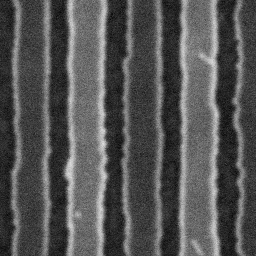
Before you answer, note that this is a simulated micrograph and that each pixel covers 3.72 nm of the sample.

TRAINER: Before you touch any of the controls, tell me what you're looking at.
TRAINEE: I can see lines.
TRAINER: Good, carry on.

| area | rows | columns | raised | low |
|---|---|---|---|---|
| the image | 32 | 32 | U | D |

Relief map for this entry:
DDUUUUDDDUUUUDDDUUUUDDDUUUUDDDUU
DDUUUUDDDUUUUDDDUUUUDDDUUUUDDUUU
DDUUUUDDDUUUUDDDUUUUDDDUUUUDDUUU
DDUUUUDDDUUUUDDDUUUUDDDUUUUDDUUU
DDUUUUDDDUUUUDDDUUUUDDDUUUUDDDUU
DDUUUUDDDUUUUDDDUUUUDDDUUUUDDDUU
DDUUUUDDDUUUUDDDUUUUDDDUUUUDDDUU
DDUUUUDDDUUUUDDDUUUUDDDUUUUDDDUU
DDUUUUDDDUUUUDDDUUUUDDDUUUUDDDUU
DDUUUUDDDUUUUDDDUUUUDDDUUUUDDDUU
DDUUUUDDDUUUUDDDUUUUDDDUUUUDDDUU
DDUUUUDDDUUUUDDDUUUUDDDUUUUDDDUU
DDUUUUDDDUUUUDDUUUUUDDDUUUUDDUUU
DDUUUUDDDUUUUDDDUUUUDDDUUUUDDDUU
DDUUUUDDDUUUUDDDUUUUDDDUUUUDDUUU
DDUUUUDDDUUUUDDDUUUUDDDUUUUDDUUU
DDUUUUDDDUUUUDDDUUUUDDDUUUUDDDUU
DDUUUUDDDUUUUDDDUUUUDDDUUUUDDDUU
DDUUUUDDDUUUUDDDUUUUDDDUUUUDDDUU
DDUUUUDDDUUUUDDDUUUUDDDUUUUDDDUU
DDUUUUDDDUUUUDDUUUUUDDDUUUUDDDUU
DDUUUUDDUUUUUDDDUUUUDDDUUUUDDDUU
DDUUUUDDDUUUUDDDUUUUDDDUUUUDDDUU
DDUUUUDDDUUUUDDUUUUUDDDUUUUDDDUU
DDUUUUDDDUUUUDDUUUUUDDDUUUUDDDUU
DDUUUUDDDUUUUDDDUUUUDDDUUUUDDDUU
DDUUUUDDDUUUUDDDUUUUDDDUUUUDDDUU
DDUUUUDDDUUUUDDDUUUUDDUUUUUDDDUU
DDUUUUDDDUUUUDDDUUUUDDDUUUUDDDUU
DDUUUUDDDUUUUDDDUUUUDDDUUUUDDDUU
DDUUUUDDDUUUUDDDUUUUDDDUUUUDDDUU
DDUUUUDDDUUUUDDDUUUUDDDUUUUDDDUU